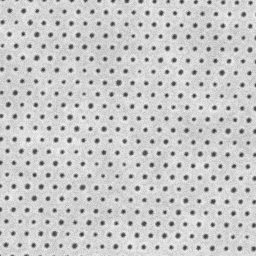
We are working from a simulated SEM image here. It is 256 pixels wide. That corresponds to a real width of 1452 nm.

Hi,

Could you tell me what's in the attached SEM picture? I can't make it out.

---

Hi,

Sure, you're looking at a regular array of holes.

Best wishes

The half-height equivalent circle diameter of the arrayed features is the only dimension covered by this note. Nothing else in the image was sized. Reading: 24.8 nm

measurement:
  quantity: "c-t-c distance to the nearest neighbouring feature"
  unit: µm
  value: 0.0759